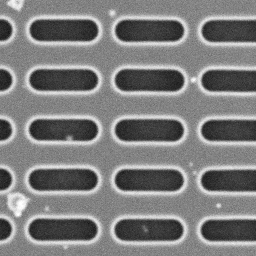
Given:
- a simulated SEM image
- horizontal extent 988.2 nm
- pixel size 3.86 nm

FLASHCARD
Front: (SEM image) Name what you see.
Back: groups of lines, slits or small figures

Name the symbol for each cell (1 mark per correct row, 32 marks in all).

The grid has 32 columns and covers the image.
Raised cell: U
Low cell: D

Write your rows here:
UUUUUUUUUUUUUUUUUUUUUUUUUUUUUUUU
UUUUUUUUUUUUUUUUUUUUUUUUUUUUUUUU
DUUUDDDDDDDDUUUDDDDDDDUUUUDDDDDD
DDUUDDDDDDDDUUDDDDDDDDDUUDDDDDDD
DUUUDDDDDDDDUUDDDDDDDDDUUDDDDDDD
UUUUUUUUUUUUUUUUUUUUUUUUUUUUUUUU
UUUUUUUUUUUUUUUUUUUUUUUUUUUUUUUU
UUUUUUUUUUUUUUUUUUUUUUUUUUUUUUUU
UUUUUUUUUUUUUUUUUUUUUUUUUUUUUUUU
DDUUDDDDDDDDUUDDDDDDDDDUUDDDDDDD
DDUUDDDDDDDDUUDDDDDDDDDUUDDDDDDD
UUUUUUDDDDUUUUUUDDDDDDUUUUUDDDDD
UUUUUUUUUUUUUUUUUUUUUUUUUUUUUUUU
UUUUUUUUUUUUUUUUUUUUUUUUUUUUUUUU
UUUUUUUUUUUUUUUUUUUUUUUUUUUUUUUU
DUUUDDDDDDDDUUDDDDDDDDDUUDDDDDDD
DDUUDDDDDDDDUUDDDDDDDDDUUDDDDDDD
DUUUDDDDDDDDUUUDDDDDDDDUUUDDDDDD
UUUUUUUUUUUUUUUUUUUUUUUUUUUUUUUU
UUUUUUUUUUUUUUUUUUUUUUUUUUUUUUUU
UUUUUUUUUUUUUUUUUUUUUUUUUUUUUUUU
DUUUDDDDDDDDUUUDDDDDDDDUUUDDDDDD
DDUDDDDDDDDDUUDDDDDDDDDUUDDDDDDD
DUUUDDDDDDDDUUUDDDDDDDDUUDDDDDDD
UUUUUUUUUUUUUUUUUUUUUUUUUUUUUUUU
UUUUUUUUUUUUUUUUUUUUUUUUUUUUUUUU
UUUUUUUUUUUUUUUUUUUUUUUUUUUUUUUU
DUUUDDDDDDDDUUUDDDDDDDUUUUDDDDDD
DDUDDDDDDDDDUUDDDDDDDDDUUDDDDDDD
DUUUDDDDDDDDUUDDDDDDDDDUUDDDDDDD
UUUUUUUUUUUUUUUUUUUUUUUUUUUUUUUU
UUUUUUUUUUUUUUUUUUUUUUUUUUUUUUUU